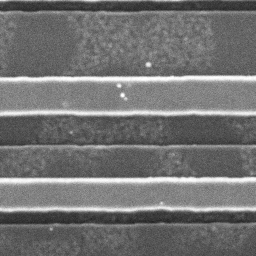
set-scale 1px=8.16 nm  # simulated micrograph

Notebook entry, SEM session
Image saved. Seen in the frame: lines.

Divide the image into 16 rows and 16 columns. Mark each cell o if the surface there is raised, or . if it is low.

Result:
................
................
................
................
................
oooooooooooooooo
oooooooooooooooo
................
................
................
................
oooooooooooooooo
oooooooooooooooo
................
................
................